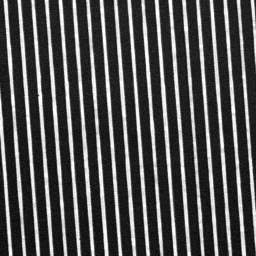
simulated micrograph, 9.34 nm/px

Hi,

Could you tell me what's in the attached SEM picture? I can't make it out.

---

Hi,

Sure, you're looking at parallel lines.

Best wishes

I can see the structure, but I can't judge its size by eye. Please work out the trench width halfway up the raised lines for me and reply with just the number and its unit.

0.105 micrometres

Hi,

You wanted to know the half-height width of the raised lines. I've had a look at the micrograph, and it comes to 20.9 nm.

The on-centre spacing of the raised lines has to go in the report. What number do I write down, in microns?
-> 0.128